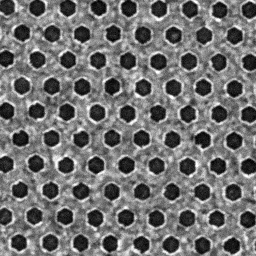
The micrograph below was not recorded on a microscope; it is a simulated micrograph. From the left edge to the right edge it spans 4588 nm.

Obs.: a regular array of holes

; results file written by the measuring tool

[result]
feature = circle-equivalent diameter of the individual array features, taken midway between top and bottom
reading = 311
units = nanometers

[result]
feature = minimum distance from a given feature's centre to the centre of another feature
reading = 0.529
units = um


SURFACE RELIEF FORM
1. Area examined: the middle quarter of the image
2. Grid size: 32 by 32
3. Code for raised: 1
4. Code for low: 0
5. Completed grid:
00011110001111000011110000111000
11111111111111110111111001111110
11111111111111111111111111111111
11111111111101111111111111111111
11100011110000111100011111000111
11100001110000111100001110000011
11000001110000111100001110000011
11100011111001111100011111000111
11111111111111111111111111111111
11111111111111111111111111111111
00111110011111100111110001111100
00011100001111000011100000111000
00011100001111000011110000111000
00011100001111000011100001111000
11111111111111100111111011111100
11111111111111111111111111111111
11111111111001111110111111111111
11000011110000111000011110000111
11000001110000111000001110000111
11000001110000111000001110000111
11100011111001111100011111000111
11111111111111111111111111111111
11111111111111111111111111111111
00111110011111000111110011111101
00011100001110000011100001111000
00011100001110000011100001111000
00111100001111000011100001111000
11111111011111101111111011111100
11111111111111111111111111111111
11111111111111111111111111111111
11100011110001111100011110000111
11000011110000111000001110000111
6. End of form